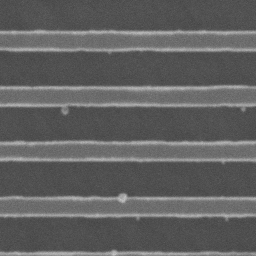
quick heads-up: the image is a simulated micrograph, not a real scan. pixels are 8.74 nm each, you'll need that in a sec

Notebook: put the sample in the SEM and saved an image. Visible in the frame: lines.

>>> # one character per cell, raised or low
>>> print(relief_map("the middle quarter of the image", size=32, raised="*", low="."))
................................
................................
................................
................................
................................
................................
********************************
********************************
********************************
********************************
*..*.*******.*****.*************
................................
................................
................................
................................
................................
................................
................................
................................
*********........********.....*.
********************************
********************************
********************************
********************************
................................
................................
................................
................................
................................
................................
................................
................................